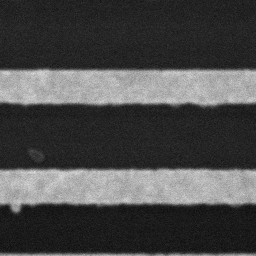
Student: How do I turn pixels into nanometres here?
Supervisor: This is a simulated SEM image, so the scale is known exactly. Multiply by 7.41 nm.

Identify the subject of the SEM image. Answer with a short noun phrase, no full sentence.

lines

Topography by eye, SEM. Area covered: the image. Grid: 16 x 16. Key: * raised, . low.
................
................
................
................
****************
****************
................
................
................
................
................
****************
****************
................
................
................